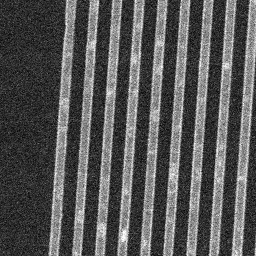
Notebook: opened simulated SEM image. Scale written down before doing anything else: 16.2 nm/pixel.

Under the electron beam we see parallel lines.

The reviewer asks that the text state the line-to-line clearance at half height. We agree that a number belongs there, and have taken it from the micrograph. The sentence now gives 232 nanometres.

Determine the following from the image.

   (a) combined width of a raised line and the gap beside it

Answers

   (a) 369 nanometers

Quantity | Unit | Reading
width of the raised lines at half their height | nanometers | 139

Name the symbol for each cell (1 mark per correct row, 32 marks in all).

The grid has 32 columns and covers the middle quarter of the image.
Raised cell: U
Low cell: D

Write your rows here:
UUDDDUUDDDDUUDDDDUUDDDUUDDDDUUDD
UUDDDUUDDDDUUDDDDUUDDDUUDDDDUUDD
UDDDDUUDDDDUUDDDDUUDDDUUDDDDUUDD
UDDDDUUDDDDUUDDDDUDDDDUUDDDDUUDD
UDDDDUUDDDDUUDDDUUDDDDUUDDDDUUDD
UDDDDUUDDDDUUDDDUUDDDDUUDDDDUUDD
UDDDDUUDDDDUUDDDUUDDDDUUDDDDUUDD
UDDDDUUDDDDUUDDDUUDDDDUUDDDDUUDD
UDDDDUUDDDDUUDDDUUDDDDUUDDDDUUDD
UDDDDUUDDDDUUDDDUUDDDDUUDDDDUUDD
UDDDDUUDDDDUDDDDUUDDDDUUDDDDUUDD
UDDDDUUDDDUUDDDDUUDDDDUUDDDDUDDD
UDDDDUUDDDUUDDDDUUDDDDUUDDDUUDDD
UDDDDUUDDDUUDDDDUUDDDDUUDDDUUDDD
UDDDUUDDDDUUDDDDUUDDDDUDDDDUUDDD
UDDDUUDDDDUUDDDDUUDDDUUDDDDUUDDD
UDDDUUDDDDUUDDDDUUDDDUUDDDDUUDDD
DDDDUUDDDDUUDDDDUUDDDUUDDDDUUDDD
DDDDUUDDDDUUDDDDUDDDDUUDDDDUUDDD
DDDDUUDDDDUUDDDDUDDDDUUDDDDUUDDD
DDDDUUDDDDUUDDDDUDDDDUUDDDDUUDDD
DDDDUUDDDDUUDDDDUDDDDUUDDDDUUDDD
DDDDUUDDDDUUDDDUUDDDDUUDDDDUUDDD
DDDDUUDDDDUUDDDUUDDDDUUDDDDUUDDD
DDDDUUDDDDUUDDDUUDDDDUUDDDDUUDDD
DDDDUUDDDUUDDDDUUDDDDUUDDDDUUDDD
DDDDUUDDDUUDDDDUUDDDDUUDDDUUDDDD
DDDDUUDDDUUDDDDUUDDDDUUDDDUUDDDD
DDDDUDDDDUUDDDDUUDDDDUUDDDUUDDDD
DDDUUDDDDUUDDDDUUDDDUUDDDDUUDDDD
DDDUUDDDDUUDDDDUUDDDUUDDDDUUDDDD
DDDUUDDDDUUDDDDUUDDDUUDDDDUUDDDD